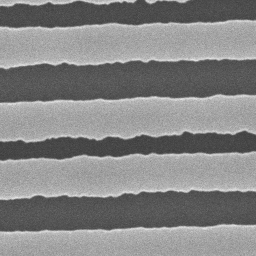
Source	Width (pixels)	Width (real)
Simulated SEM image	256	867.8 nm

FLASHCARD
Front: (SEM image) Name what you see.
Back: lines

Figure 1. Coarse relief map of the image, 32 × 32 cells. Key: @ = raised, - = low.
@@--@---------------------------
--------------------------------
--------------------------------
@@@@@@@@@@@@@@@@@@@@@@@@@@@@@@@@
@@@@@@@@@@@@@@@@@@@@@@@@@@@@@@@@
@@@@@@@@@@@@@@@@@@@@@@@@@@@@@@@@
@@@@@@@@@@@@@@@@@@@@@@@@@@@@@@@@
@@@@@@@@@@@@@@@@@@@@@@@-@-------
--------------------------------
--------------------------------
--------------------------------
--------------------------------
------------@--@@@@@@@@@@@@@@@@@
@@@@@@@@@@@@@@@@@@@@@@@@@@@@@@@@
@@@@@@@@@@@@@@@@@@@@@@@@@@@@@@@@
@@@@@@@@@@@@@@@@@@@@@@@@@@@@@@@@
@@@@@@@@@@@@@@@@@@@@@@@-@@-@@@-@
@@@@@@--------------------------
--------------------------------
----------@-----@@@@@@@@@@@@@@@@
@@@@@@@@@@@@@@@@@@@@@@@@@@@@@@@@
@@@@@@@@@@@@@@@@@@@@@@@@@@@@@@@@
@@@@@@@@@@@@@@@@@@@@@@@@@@@@@@@@
@@@@@@@@@@@@@@@@@@@@@@@@@@@@@@@@
@@@@-@@-@@@@@@@-----------------
--------------------------------
--------------------------------
--------------------------------
-----------------@--@@@@@@@@@@@@
@@@@@@@@@@@@@@@@@@@@@@@@@@@@@@@@
@@@@@@@@@@@@@@@@@@@@@@@@@@@@@@@@
@@@@@@@@@@@@@@@@@@@@@@@@@@@@@@@@